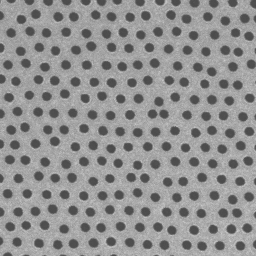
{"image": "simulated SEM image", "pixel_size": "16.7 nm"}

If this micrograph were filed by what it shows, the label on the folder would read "a regular array of holes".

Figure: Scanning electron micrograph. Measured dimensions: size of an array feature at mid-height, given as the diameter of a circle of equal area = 0.166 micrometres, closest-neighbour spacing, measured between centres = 0.272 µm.